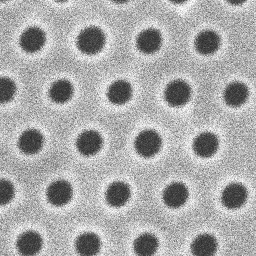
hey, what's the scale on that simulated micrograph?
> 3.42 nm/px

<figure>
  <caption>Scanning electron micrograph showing a regular array of holes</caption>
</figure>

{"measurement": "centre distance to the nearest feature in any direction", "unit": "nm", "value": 199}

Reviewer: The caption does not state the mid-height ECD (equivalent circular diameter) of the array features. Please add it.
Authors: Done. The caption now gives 0.0921 µm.